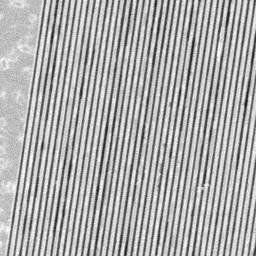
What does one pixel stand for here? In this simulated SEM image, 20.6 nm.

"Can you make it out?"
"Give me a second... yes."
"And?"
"parallel lines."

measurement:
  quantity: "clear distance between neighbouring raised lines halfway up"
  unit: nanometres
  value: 74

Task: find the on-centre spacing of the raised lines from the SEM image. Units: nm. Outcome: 126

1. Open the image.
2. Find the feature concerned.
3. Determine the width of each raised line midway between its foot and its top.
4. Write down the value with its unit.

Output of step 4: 56.2 nm